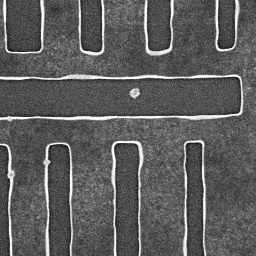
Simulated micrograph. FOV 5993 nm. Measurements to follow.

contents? groups of lines, slits or small figures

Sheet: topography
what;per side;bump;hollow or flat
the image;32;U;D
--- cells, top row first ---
UDDDDUUUUUDDDUUUUUDDDDUUUUUDDDUU
UDDDDUUUUUDDDUUUUUDDDDUUUUUDDDUU
UDDDDUUUUUDDDUUUUUDDDUUUUUUDDDUU
UDDDDUUUUUDDDUUUUUDDDUUUUUUDDDUU
UDDDDUUUUUDDDUUUUUDDDDUUUUUDDDUU
UDDDDUUUUUDDDUUUUUDDDUUUUUUDDUUU
UUDDUUUUUUUDDUUUUUUDDUUUUUUUUUUU
UUUUUUUUUUUUUUUUUUUUUUUUUUUUUUUU
UUUUUUUUUUUUUUUUUUUUUUUUUUUUUUUU
UUUUUUUUUUUUUUUUUUUUUUUUUUUUUUUU
DDDDDDDDDDDDDDDDDDDDDDDDDDDDDDUU
DDDDDDDDDDDDDDDDDDDDDDDDDDDDDDUU
DDDDDDDDDDDDDDDDDDDDDDDDDDDDDDUU
DDDDDDDDDDDDDDDDDDDDDDDDDDDDDDUU
DDDDDDDDDDDDDDDDDDDDDDDDDDDDUUUU
UUUUUUUUUUUUUUUUUUUUUUUUUUUUUUUU
UUUUUUUUUUUUUUUUUUUUUUUUUUUUUUUU
UUUUUUUUUUUUUUUUUUUUUUUUUUUUUUUU
DUUUUUDDDUUUUUDDDDUUUUUDDUUUUUUU
DUUUUUDDDUUUUUDDDDUUUUUDDUUUUUUU
DUUUUUDDDUUUUUDDDDUUUUUDDUUUUUUU
DUUUUUDDDUUUUUDDDUUUUUUDDUUUUUUU
DUUUUUDDDUUUUUDDDUUUUUUDDUUUUUUU
DUUUUUDDDUUUUUDDDUUUUUUDDDUUUUUU
DUUUUUDDDUUUUUDDDUUUUUUDDDUUUUUU
DUUUUUDDDUUUUUDDDUUUUUUDDDUUUUUU
DUUUUUDDDUUUUUDDDUUUUUUDDDUUUUUU
DUUUUUDDDUUUUUDDDUUUUUUDDDUUUUUU
DUUUUUDDDUUUUUDDDUUUUUUDDDUUUUUU
DUUUUUDDDUUUUUDDDUUUUUUDDUUUUUUU
DUUUUUDDDUUUUUDDDUUUUUUDDUUUUUUU
DUUUUUDDDUUUUUDDDUUUUUUDDDUUUUUU